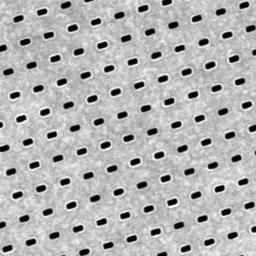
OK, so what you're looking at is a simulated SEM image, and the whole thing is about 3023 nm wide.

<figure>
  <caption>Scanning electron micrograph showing a regular array of holes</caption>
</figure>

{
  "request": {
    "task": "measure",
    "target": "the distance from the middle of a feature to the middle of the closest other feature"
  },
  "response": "0.285 um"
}